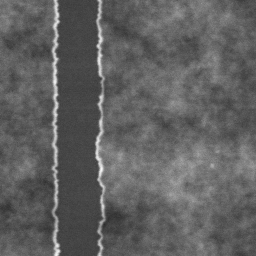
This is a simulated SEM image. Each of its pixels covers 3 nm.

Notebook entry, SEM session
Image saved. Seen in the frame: one or a few lines or trenches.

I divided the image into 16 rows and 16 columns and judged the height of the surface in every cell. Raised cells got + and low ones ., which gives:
++++..++++++++++
++++..++++++++++
++++..++++++++++
+++...++++++++++
+++...++++++++++
+++...++++++++++
+++...++++++++++
+++...++++++++++
+++...++++++++++
+++...++++++++++
+++...++++++++++
++++..++++++++++
++++..++++++++++
+++...++++++++++
+++...++++++++++
++++..++++++++++